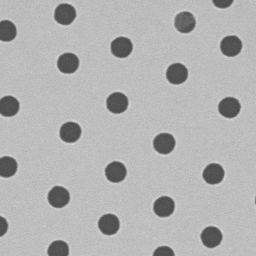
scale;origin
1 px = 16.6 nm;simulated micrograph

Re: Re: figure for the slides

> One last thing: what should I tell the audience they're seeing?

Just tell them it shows a regular array of holes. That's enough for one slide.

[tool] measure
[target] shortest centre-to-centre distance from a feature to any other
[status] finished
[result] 924 nm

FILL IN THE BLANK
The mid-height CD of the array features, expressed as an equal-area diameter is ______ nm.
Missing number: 374